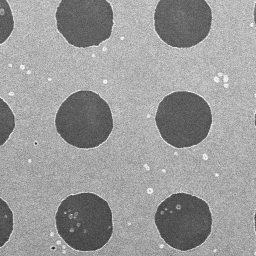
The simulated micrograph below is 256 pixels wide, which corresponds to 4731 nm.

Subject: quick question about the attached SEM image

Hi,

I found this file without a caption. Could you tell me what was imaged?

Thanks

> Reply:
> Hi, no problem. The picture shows holes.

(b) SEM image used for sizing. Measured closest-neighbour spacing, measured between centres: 1.83 um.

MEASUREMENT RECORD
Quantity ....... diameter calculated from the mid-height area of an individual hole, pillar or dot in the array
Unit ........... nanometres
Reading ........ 1070